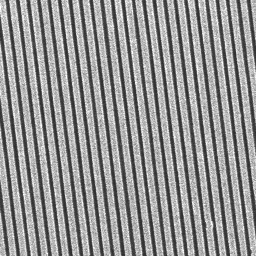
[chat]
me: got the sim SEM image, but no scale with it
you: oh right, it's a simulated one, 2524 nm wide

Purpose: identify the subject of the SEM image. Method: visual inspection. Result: parallel lines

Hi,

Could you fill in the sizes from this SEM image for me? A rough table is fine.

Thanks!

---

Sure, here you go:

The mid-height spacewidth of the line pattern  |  33.1 nm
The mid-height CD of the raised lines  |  67.2 nanometers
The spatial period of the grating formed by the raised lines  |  10.4 pixels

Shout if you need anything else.